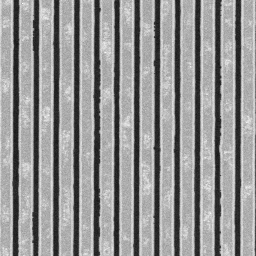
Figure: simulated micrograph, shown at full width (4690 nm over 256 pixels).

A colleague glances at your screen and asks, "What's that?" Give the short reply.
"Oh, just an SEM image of parallel lines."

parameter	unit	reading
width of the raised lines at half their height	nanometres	224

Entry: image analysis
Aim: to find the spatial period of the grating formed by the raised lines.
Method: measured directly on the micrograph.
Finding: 370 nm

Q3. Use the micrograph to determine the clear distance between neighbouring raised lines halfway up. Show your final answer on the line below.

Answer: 137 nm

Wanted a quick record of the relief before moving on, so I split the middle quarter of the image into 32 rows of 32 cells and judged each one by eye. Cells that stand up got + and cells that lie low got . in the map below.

++..+++..+++..+++..+++..+++..+++
++..+++..+++..+++..+++..+++..+++
++..+++..+++..+++..+++..+++..+++
++..+++..+++..+++..+++..+++..+++
++..+++..+++..+++..+++..+++..+++
++..+++..+++..+++..+++..+++..+++
++..+++..+++..+++..+++..+++..+++
++..+++..+++..+++..+++..+++..+++
++..+++..+++..+++..+++..+++..+++
++..+++..+++..+++..+++..+++..+++
++..+++..+++..+++..+++..+++..+++
++..+++..+++..+++..+++..+++..+++
++..+++..+++..+++..+++..+++..+++
++..+++..+++..+++..+++..+++..+++
++..+++..+++..+++..+++..+++..+++
++..+++..+++..+++..+++..+++..+++
++..+++..+++..+++..+++..+++..+++
++..+++..+++..+++..+++..+++..+++
++..+++..+++..+++..+++..+++..+++
++..+++..+++..+++..+++..+++..+++
++..+++..+++..+++..+++..+++..+++
++..+++..+++..+++..+++...++..+++
++..+++..+++..+++..+++..+++..+++
++..+++..+++..+++..+++..+++..+++
++..+++..+++..+++..+++..+++..+++
++..+++..+++..+++..+++..+++..+++
++..+++..+++..+++..+++..+++..+++
++..+++..+++..+++..+++..+++..+++
++..+++..+++..+++..+++..+++..+++
++..+++..+++..+++..+++..+++..+++
++..+++..+++..+++..+++..+++..+++
++..+++..+++..+++..+++..+++..+++